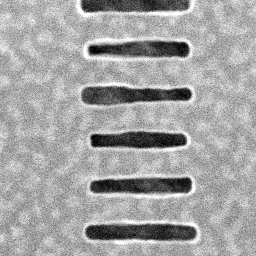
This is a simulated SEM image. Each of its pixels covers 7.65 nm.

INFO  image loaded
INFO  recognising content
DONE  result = holes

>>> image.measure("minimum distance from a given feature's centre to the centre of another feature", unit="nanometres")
351